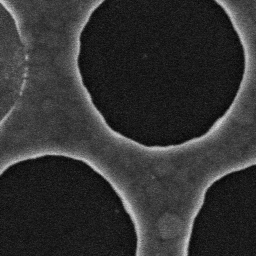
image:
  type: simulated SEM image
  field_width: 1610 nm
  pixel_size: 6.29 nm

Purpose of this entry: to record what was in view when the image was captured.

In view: holes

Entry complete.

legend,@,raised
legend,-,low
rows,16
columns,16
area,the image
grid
@@@@@@--------@@
@@@@@----------@
@@@@@----------@
@@@@@----------@
@@@@@----------@
@@@@@----------@
@@@@@@--------@@
@@@@@@@-------@@
@@@@@@@@-----@@@
@@@@@@@@@@@@@@@@
------@@@@@@@@@-
-------@@@@@@---
--------@@@@@---
--------@@@@----
---------@@@----
---------@@@----